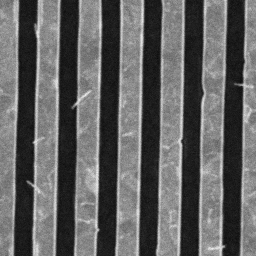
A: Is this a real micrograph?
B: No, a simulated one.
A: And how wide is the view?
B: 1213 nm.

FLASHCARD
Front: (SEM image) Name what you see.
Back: parallel lines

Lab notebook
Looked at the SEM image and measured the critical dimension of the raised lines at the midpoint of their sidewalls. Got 97.7 nanometres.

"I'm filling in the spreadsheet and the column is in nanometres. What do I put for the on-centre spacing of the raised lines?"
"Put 197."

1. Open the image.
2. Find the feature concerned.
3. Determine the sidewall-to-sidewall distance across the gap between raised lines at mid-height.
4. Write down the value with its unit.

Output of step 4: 97.7 nm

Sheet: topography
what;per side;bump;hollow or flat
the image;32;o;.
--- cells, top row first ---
oo...oo...oo...ooo..ooo...oo...o
oo...oo...oo...ooo..ooo...oo...o
oo...oo...ooo..ooo..ooo...oo...o
oo...oo...ooo..ooo..ooo...oo...o
oo...oo...ooo..ooo..ooo...oo...o
oo...oo...oo...ooo..ooo...oo...o
oo...oo...oo...ooo..ooo...oo...o
oo...oo...oo...ooo..ooo...oo...o
oo...oo...oo...ooo..ooo..ooo...o
oo...oo...oo...ooo..ooo..ooo...o
oo...oo...oo...ooo..ooo..ooo..oo
oo...oo...oo...ooo..ooo...oo...o
oo...oo...oo...oo...ooo..ooo...o
oo...oo...oo...oo...ooo..ooo...o
oo...oo...oo...oo...ooo..ooo...o
oo...oo...oo...oo...ooo..ooo..oo
oo...oo...oo...oo...ooo..ooo..oo
oo..ooo...oo...oo...ooo..ooo..oo
oo...oo...oo...oo...ooo..ooo..oo
oo..ooo...oo...oo...ooo..ooo..oo
oo..ooo...oo...oo...oo...ooo...o
oo..ooo...oo...oo...ooo..ooo..oo
oo..ooo...oo...oo...ooo..ooo..oo
oo..ooo...oo...oo...ooo..ooo..oo
oo..ooo...oo...oo...ooo..ooo..oo
oo..ooo...oo...oo...oo...ooo..oo
oo..ooo...oo...oo...oo...ooo..oo
oo..ooo...oo...oo...oo...ooo..oo
oo..ooo...oo...oo...oo...ooo..oo
oo..ooo...oo...oo...oo...ooo..oo
oo..ooo...oo...oo...oo...ooo..oo
oo..ooo...oo...oo...oo...ooo..oo